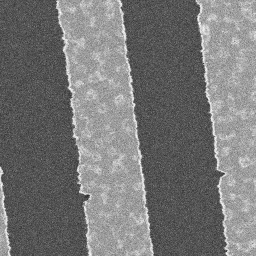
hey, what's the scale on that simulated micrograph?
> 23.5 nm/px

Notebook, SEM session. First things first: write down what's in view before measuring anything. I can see one or a few lines or trenches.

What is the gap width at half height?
1800 nm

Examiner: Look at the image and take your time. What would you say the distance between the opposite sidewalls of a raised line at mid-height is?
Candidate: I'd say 1440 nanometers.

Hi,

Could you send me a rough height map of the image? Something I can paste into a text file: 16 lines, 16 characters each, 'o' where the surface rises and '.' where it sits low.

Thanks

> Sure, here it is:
....oooo....oooo
....oooo....oooo
....oooo.....ooo
....oooo.....ooo
....oooo.....ooo
....oooo.....ooo
.....ooo.....ooo
.....ooo.....ooo
.....oooo....ooo
.....oooo....ooo
.....oooo.....oo
.....oooo.....oo
.....oooo.....oo
.....oooo.....oo
.....oooo.....oo
o.....oooo....oo